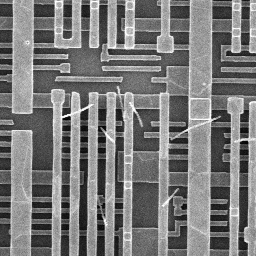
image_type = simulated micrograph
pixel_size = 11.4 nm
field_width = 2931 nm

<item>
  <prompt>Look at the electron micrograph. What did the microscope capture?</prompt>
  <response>wiring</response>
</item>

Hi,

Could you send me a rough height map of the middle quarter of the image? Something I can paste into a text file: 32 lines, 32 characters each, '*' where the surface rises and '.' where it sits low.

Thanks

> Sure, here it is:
...............................*
...............................*
...............................*
...............................*
...............................*
...............................*
...............................*
..*...**...**..**.......**.....*
..**..**...**..**.......**.....*
..**..**...**..**.......**.....*
..**..**...**..**.......**.....*
..**..**...**..***......**.....*
.***..**...**..**.......**.....*
..**..**...**..**.......**.....*
..**..**...**..**.......**.....*
..**..**...**..**.......**.....*
..**..**...**..**.......**.....*
..**..**..***..**.......**.....*
..**..**...**..**.......**.....*
..**..**...**..**.......**.....*
..**..**...**..**.......**.....*
..**..**...**..**.......**.....*
..**..**...**..**.......**.....*
..**..**...**..**.......**.....*
..**..**...**..**.......**.....*
..**..**...**..**.......**.....*
..**..**...**..**.......**.....*
..**..**...**..**.......**.....*
..**..**...**..**.......**.....*
..**..**...**..**.......**.....*
..**..**...**..**.......**.....*
..**..**...**..**.......**.....*